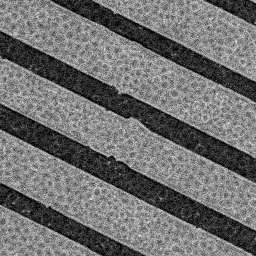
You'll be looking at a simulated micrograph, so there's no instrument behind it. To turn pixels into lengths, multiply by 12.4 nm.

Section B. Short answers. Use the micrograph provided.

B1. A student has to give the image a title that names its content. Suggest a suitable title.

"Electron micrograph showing one or a few lines or trenches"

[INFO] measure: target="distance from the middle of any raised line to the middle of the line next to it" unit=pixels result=68.5